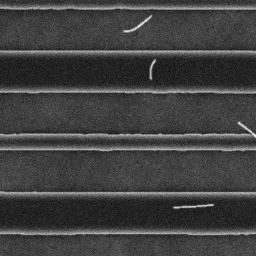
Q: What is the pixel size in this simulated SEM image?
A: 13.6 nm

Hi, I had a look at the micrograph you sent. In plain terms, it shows lines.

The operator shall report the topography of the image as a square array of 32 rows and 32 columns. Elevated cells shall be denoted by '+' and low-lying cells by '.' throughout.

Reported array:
++++++++++++++++++++++++++++++++
................................
................................
................................
................................
................................
++++++++++++++++++++++++++++++++
++++++++++++++++++++++++++++++++
++++++++++++++++++++++++++++++++
++++++++++++++++++++++++++++++++
++++++++++++++++++++++++++++++++
...++..........++..+++++..++++++
................................
................................
................................
................................
................................
++++++++++++++++++++++++++++++++
++++++++++++++++++++++++++++++++
................................
................................
................................
................................
................................
++++++++++++++++++++++++++++++++
++++++++++++++++++++++++++++++++
++++++++++++++++++++++++++++++++
++++++++++++++++++++++++++++++++
++++++++++++++++++++++++++++++++
................................
................................
................................